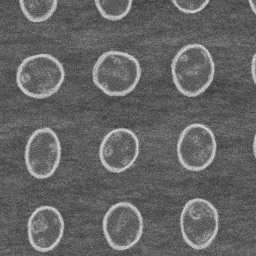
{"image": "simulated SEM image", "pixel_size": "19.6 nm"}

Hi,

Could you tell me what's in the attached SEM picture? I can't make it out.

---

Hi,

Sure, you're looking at a regular array of raised bodies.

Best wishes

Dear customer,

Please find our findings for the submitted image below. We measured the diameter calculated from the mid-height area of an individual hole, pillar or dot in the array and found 776 nm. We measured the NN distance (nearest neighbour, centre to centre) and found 76 pixels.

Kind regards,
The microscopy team